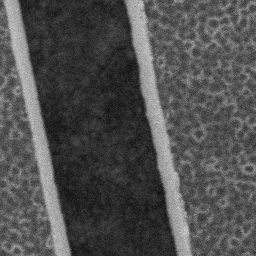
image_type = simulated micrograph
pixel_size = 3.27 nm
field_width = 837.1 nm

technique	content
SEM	one or a few lines or trenches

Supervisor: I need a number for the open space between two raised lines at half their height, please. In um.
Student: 0.392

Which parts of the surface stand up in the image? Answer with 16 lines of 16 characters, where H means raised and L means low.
HLLLLLLLHHHHHHHH
HLLLLLLLLHHHHHHH
HLLLLLLLLHHHHHHH
HLLLLLLLLHHHHHHH
HHLLLLLLLHHHHHHH
HHLLLLLLLHHHHHHH
HHLLLLLLLLHHHHHH
HHLLLLLLLLHHHHHH
HHLLLLLLLLHHHHHH
HHHLLLLLLLHHHHHH
HHHLLLLLLLHHHHHH
HHHLLLLLLLLHHHHH
HHHLLLLLLLLHHHHH
HHHLLLLLLLLHHHHH
HHHHLLLLLLLHHHHH
HHHHLLLLLLLHHHHH